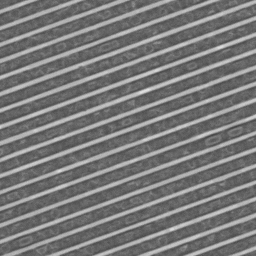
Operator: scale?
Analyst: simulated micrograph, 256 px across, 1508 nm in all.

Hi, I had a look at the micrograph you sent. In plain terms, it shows parallel lines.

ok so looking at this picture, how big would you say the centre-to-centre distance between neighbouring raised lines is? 91 nanometers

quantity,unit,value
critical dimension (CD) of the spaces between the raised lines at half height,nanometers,74.7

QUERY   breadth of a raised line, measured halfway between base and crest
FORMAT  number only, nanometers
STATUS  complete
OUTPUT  16